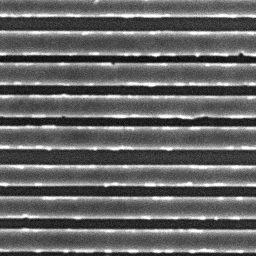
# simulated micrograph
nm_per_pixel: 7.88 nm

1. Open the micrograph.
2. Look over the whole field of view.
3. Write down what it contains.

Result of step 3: parallel lines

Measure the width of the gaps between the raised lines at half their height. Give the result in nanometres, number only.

91.5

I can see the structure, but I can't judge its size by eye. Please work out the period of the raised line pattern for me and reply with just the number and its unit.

259 nanometres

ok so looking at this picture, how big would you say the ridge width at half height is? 0.17 microns